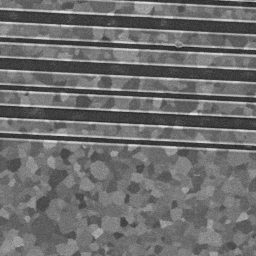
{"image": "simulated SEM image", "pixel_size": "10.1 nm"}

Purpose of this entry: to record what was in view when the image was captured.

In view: parallel lines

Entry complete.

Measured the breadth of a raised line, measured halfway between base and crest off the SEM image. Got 139 nanometers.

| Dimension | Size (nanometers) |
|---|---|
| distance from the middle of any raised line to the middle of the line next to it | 244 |